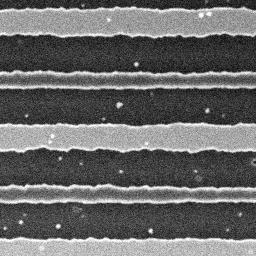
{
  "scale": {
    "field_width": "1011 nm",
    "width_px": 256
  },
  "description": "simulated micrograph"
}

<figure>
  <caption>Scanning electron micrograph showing lines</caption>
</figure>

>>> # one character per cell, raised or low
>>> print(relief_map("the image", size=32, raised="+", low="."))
................................
++++++++++++++++++++++++++++++++
++++++++++++++++++++++++++++++++
++++++++++++++++++++++++++++++++
.......++.......+.+++..+++......
................................
................................
................................
................................
++++++++++++++++++++++++++++++++
++++++++++++++++++++++++++++++++
................................
................................
................................
................................
......................+.........
++++++++++++++++++++++++++++++++
++++++++++++++++++++++++++++++++
+++++.++++++++++++++++++++++++++
................................
................................
................................
................................
++++++++++++++++++++++++.++.+++.
++++++++++++++++++++++++++++++++
................................
................................
................................
................................
................................
++++++++++++++++++++++++++++++++
++++++++++++++++++++++++++++++++